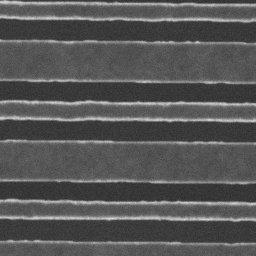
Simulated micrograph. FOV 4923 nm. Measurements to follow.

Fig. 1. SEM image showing lines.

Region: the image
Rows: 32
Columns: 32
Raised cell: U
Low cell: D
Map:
UUUUUUUUUUUUUUUUUUUUUUUUUDDDDDDD
UUUUUUUUUUUUUUUUUUUUUUUUUUUUUUUU
DDDDDDDDDDDUUUDUUUUUUUUUUUUUUUUU
DDDDDDDDDDDDDDDDDDDDDDDDDDDDDDDD
DDDDDDDDDDDDDDDDDDDDDDDDDDDDDDDD
UUUUUUUUUUUUUUUUUUUUUUUUUUUUUUUU
UUUUUUUUUUUUUUUUUUUUUUUUUUUUUUUU
UUUUUUUUUUUUUUUUUUUUUUUUUUUUUUUU
UUUUUUUUUUUUUUUUUUUUUUUUUUUUUUUU
UUUUUUUUUUUUUUUUUUUUUUUUUUUUUUUU
DDDDDDDDDDDDDDDDDDDDDDDDDDDDDDDD
DDDDDDDDDDDDDDDDDDDDDDDDDDDDDDDD
DDDDDDDDDDDDDDDDDDDDDDDDDDDDDDDD
UUUUUUUUUUUUUUUUUUUUUUUUUUUUUUUU
UUUUUUUUUUUUUUUUUUUUUUUUUUUUUUUU
DDDDDDDDDDDDDDDDDDDDDDDDDDDDDDDD
DDDDDDDDDDDDDDDDDDDDDDDDDDDDDDDD
DDDDDDDDDDDDDDDDDDDDDDDDDDDDDDDD
UUUUUUUUUUUUUUUUUUUUUUUUUUUUUUUU
UUUUUUUUUUUUUUUUUUUUUUUUUUUUUUUU
UUUUUUUUUUUUUUUUUUUUUUUUUUUUUUUU
UUUUUUUUUUUUUUUUUUUUUUUUUUUUUUUU
UUUUUUUUUUUUUUUUUUUUUUUUUUUUUUUU
DDDDDDDDDDDDDDDDDDDDDDDDDDDDDDDD
DDDDDDDDDDDDDDDDDDDDDDDDDDDDDDDD
UUUUUUUUUUUUUUUUUUUUUUUUUUUUUUUU
UUUUUUUUUUUUUUUUUUUUUUUUUUUUUUUU
DDDDDDDDDDDDDDDDDDDDDUUUUUUUUUUU
DDDDDDDDDDDDDDDDDDDDDDDDDDDDDDDD
DDDDDDDDDDDDDDDDDDDDDDDDDDDDDDDD
UUUUUUUUUUUUUUUUUUUUUUUUUUUUUUUU
UUUUUUUUUUUUUUUUUUUUUUUUUUUUUUUU